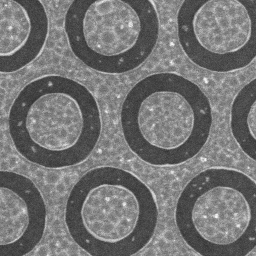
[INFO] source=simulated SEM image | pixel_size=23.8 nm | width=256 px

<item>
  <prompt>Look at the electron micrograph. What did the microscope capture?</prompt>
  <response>ring-shaped grooves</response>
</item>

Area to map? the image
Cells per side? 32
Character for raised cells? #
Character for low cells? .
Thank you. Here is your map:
##...####...####...####...####..
###...##...######...##...######.
####..##...######...##..#######.
####..##...######...##..#######.
###...##...######...##...######.
###...###..######..####..######.
##...####...###....####....##...
....######........######........
...########......#########....##
######.############....#########
###.......#######.......#######.
###........#####.........#####..
##...####...####..#####...###...
#...######..###...######..###..#
#..#######..###..#######..###..#
#..#######...##..#######..###..#
#...######...##...######..###..#
##..######..####..#####...###...
##....###...####.........#####..
###........######.......#######.
#####.....#########...##########
.##########.....#########.....##
....######.......#######........
.....####...###...#####....##...
##...####..######..###...#####..
###...##..#######...##..#######.
###...##..#######...##..#######.
###...##..#######...##..#######.
###...##...######..###...######.
###..####...####...####..#####..
#....#####........#####.........
....#######......########......#